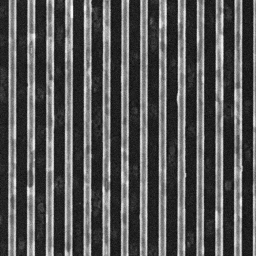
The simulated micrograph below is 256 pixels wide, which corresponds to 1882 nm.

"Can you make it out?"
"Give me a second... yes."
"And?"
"parallel lines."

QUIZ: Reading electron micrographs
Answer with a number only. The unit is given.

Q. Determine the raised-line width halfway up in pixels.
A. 6.63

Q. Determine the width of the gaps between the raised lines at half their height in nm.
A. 90.1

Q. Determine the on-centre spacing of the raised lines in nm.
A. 138